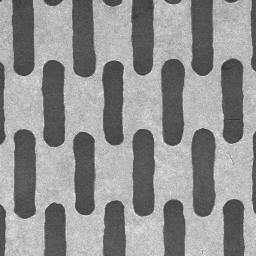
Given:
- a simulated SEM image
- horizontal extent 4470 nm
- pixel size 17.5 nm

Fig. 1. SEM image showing a regular array of holes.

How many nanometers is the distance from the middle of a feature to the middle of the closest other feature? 1040